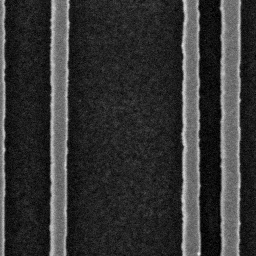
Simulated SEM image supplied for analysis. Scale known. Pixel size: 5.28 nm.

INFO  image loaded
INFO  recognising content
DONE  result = lines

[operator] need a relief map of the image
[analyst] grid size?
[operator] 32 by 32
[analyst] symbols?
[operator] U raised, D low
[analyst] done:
UDDDDDUUUDDDDDDDDDDDDDDUUDDDUUDD
UDDDDDUUDDDDDDDDDDDDDDDUUDDDUUDD
UDDDDDUUUDDDDDDDDDDDDDDUUDDDUUDD
UDDDDDUUUDDDDDDDDDDDDDDUUDDDUUDD
UDDDDDUUDDDDDDDDDDDDDDDUUDDDUUDD
UDDDDDUUDDDDDDDDDDDDDDDUUDDDUUDD
DDDDDDUUDDDDDDDDDDDDDDDUUDDDUUDD
UDDDDDUUDDDDDDDDDDDDDDDUUDDDUUDD
UDDDDDUUDDDDDDDDDDDDDDDUUDDDUUDD
UDDDDDUUDDDDDDDDDDDDDDDUUDDDUUDD
UDDDDDUUDDDDDDDDDDDDDDDUUDDDUUDD
UDDDDDUUDDDDDDDDDDDDDDDUUDDDUUDD
UDDDDDUUDDDDDDDDDDDDDDDUUDDDUUDD
UDDDDDUUDDDDDDDDDDDDDDDUUDDDUUDD
UDDDDDUUDDDDDDDDDDDDDDDUUDDDUUDD
DDDDDDUUDDDDDDDDDDDDDDDUUDDDUUDD
UDDDDDUUDDDDDDDDDDDDDDDUUDDDUUDD
UDDDDDUUDDDDDDDDDDDDDDDUUDDDUUDD
UDDDDDUUDDDDDDDDDDDDDDDUUDDDUUDD
DDDDDDUUDDDDDDDDDDDDDDDUUDDDUUDD
UDDDDDUUDDDDDDDDDDDDDDDUUDDDUUDD
UDDDDDUUDDDDDDDDDDDDDDDUUDDDUUDD
UDDDDDUUDDDDDDDDDDDDDDDUUDDDUUDD
UDDDDDUUDDDDDDDDDDDDDDDUUDDDUUDD
UDDDDDUUDDDDDDDDDDDDDDDUUDDDUUDD
DDDDDDUUDDDDDDDDDDDDDDDUUDDDUUDD
DDDDDDUUDDDDDDDDDDDDDDDUUDDDUUDD
DDDDDDUUDDDDDDDDDDDDDDDUUDDDUUDD
DDDDDDUUDDDDDDDDDDDDDDDUUDDDUUDD
UDDDDDUUDDDDDDDDDDDDDDDUUDDDUUDD
UDDDDDUUDDDDDDDDDDDDDDDUUDDDUUDD
DDDDDDUUDDDDDDDDDDDDDDDUUDDDUUDD